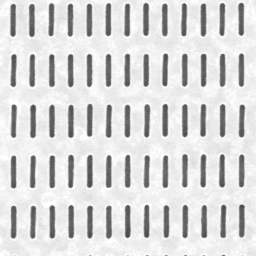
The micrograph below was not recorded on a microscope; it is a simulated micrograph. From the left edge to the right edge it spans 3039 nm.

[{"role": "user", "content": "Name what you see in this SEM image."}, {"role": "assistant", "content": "a regular array of holes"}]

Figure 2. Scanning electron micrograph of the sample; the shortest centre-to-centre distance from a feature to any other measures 224 nm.